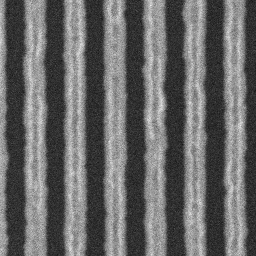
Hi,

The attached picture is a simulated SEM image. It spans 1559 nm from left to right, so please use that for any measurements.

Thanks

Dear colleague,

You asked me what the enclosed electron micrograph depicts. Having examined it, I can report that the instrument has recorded parallel lines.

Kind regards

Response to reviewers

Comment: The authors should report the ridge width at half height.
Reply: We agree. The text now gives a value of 14.9 pixels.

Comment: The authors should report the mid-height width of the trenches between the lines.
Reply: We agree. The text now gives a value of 154 nm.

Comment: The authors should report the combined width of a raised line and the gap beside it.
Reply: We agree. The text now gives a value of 243 nanometers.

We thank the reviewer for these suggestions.